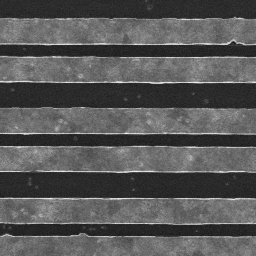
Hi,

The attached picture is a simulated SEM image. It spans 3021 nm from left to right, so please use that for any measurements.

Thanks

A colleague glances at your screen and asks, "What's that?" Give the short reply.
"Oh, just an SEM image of parallel lines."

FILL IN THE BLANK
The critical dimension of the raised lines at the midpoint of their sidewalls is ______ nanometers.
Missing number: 298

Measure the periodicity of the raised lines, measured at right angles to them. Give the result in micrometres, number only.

0.53